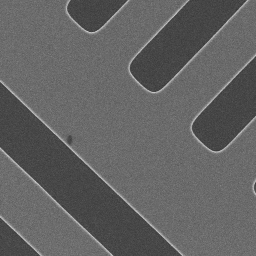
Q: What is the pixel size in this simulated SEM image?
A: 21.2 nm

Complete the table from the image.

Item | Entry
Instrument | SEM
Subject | groups of lines, slits or small figures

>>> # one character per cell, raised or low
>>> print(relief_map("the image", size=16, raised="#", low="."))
####....###....#
#####..###....##
#########....###
#########...####
########...####.
#########.####..
.############...
..##########....
....########...#
.....###########
#.....##########
##.....#########
###.....########
####.....#######
.#####....######
..#####....#####